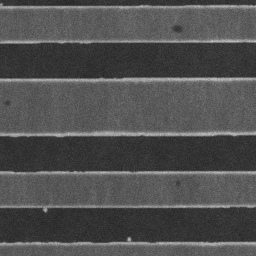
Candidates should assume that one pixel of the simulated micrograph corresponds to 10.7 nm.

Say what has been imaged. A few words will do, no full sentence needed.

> lines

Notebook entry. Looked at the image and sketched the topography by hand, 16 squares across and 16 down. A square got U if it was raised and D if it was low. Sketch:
UUUUUUUUUUUUUUUU
UUUUUUUUUUUUUUUU
UUUUUUUUUUUUUUUU
DDDDDDDDDDDDDDDD
DDDDDDDDDDDDDDDD
UUUUUUUUUUUUUUUU
UUUUUUUUUUUUUUUU
UUUUUUUUUUUUUUUU
DDDDDDDDDDDDDDDD
DDDDDDDDDDDDDDDD
DDDDDDDDDDDDDDDD
UUUUUUUUUUUUUUUU
UUUUUUUUUUUUUUUU
DDDDDDDDDDDDDDDD
DDDDDDDDDDDDDDDD
UUUUUUUUUUUUUUUU